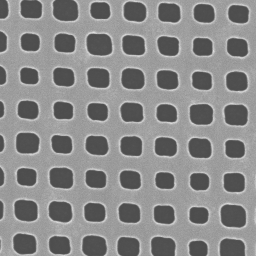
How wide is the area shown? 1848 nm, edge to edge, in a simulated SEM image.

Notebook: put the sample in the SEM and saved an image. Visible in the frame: a regular array of holes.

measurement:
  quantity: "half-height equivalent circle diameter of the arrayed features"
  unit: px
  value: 21.1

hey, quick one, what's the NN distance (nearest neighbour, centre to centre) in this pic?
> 0.242 microns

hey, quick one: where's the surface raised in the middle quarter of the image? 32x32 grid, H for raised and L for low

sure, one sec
HHHHHHHHHHHHHHHHHHHHHHHHHHHHHHHH
LLHHHHLLLLLHHHHLLLLHHHHHHLHHHHHH
LLHHHHLLLLLHHHLLLLLLHHHLLLLLHHHH
LLLHHHLLLLLHHHLLLLLLHHHLLLLLLHHH
LLLHHHLLLLLHHHLLLLLLHHHLLLLLLHHH
LLHHHHHLLLLHHHHLLLLLHHHHLLLLHHHH
HHHHHHHHHHHHHHHHHHHHHHHHHHHHHHHH
HHHHHHHHHHHHHHHHHHHHHHHHHHHHHHHH
HHHHHHHHHHHHHHHHHHHHHHHHHHHHHHHH
HHHHHHHHHHHHHHHHHHHHHHHHHHHHHHHH
LLHHHHLLLLLHHHHLLLLHHHHHLLLHHHHH
LLHHHHLLLLLHHHLLLLLLHHHLLLLLHHHL
LLHHHHLLLLLHHHLLLLLLHHHLLLLLHHHL
LLHHHHHLLLLHHHLLLLLLHHHLLLLLHHHL
HHHHHHHHHHHHHHHHLHLHHHHHHLLHHHHH
HHHHHHHHHHHHHHHHHHHHHHHHHHHHHHHH
HHHHHHHHHHHHHHHHHHHHHHHHHHHHHHHH
HHHHHHHHHHHHHHHHHHHHHHHHHHHHHHHH
LLHHHHLLLLHHHHHLLLLHHHHHLLLHHHHH
LLHHHLLLLLLHHHLLLLLHHHHLLLLLHHHH
LLHHHHLLLLLHHHLLLLLLHHHLLLLLHHHL
LLHHHHLLLLLHHHLLLLLLHHHLLLLLHHHL
HHHHHHHLLLHHHHHLLLLHHHHLLLLLHHHL
HHHHHHHHHHHHHHHHHHHHHHHHHHHHHHHH
HHHHHHHHHHHHHHHHHHHHHHHHHHHHHHHH
HHHHHHHHHHHHHHHHHHHHHHHHHHHHHHHH
LLHHHHLLHHHHHHHHHHHHHHHHHHHHHHHH
LLHHHLLLLLHHHHLLLLLHHHHLLLLHHHHH
LLHHHLLLLLLHHHLLLLLHHHHLLLLLHHHH
LLHHHHLLLLHHHHLLLLLHHHHLLLLLHHHH
LLHHHHLLLLHHHHLLLLLHHHHLLLLHHHHH
HHHHHHHHHHHHHHHHHHHHHHHHHHHHHHHH